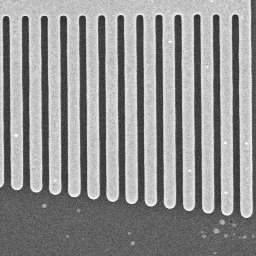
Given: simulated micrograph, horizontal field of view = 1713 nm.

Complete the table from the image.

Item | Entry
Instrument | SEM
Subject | groups of lines, slits or small figures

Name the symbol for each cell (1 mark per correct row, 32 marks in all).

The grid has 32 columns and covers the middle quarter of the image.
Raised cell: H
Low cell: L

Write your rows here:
LHHHLLHHLLLHHLLHHHLLHHHLLHHHLLHH
LHHHLLHHLLLHHLLHHHLLHHHLLHHHLLHH
LHHHLLHHLLLHHLLHHHLLHHHLLHHHLLHH
LHHHLLHHLLLHHLLHHHLLHHHLLHHHLLHH
LHHHLLHHLLLHHLLHHHLLHHHLLHHHLLHH
LHHHLLHHLLLHHLLHHHLLHHHLLHHHLLHH
LHHHLLHHLLLHHLLHHHLLHHHLLHHHLLHH
LHHHLLHHLLLHHLLHHHLLHHHLLHHHLLHH
LHHHLLHHLLLHHLLHHHLLHHHLLHHHLLHH
LHHHLLHHLLLHHLLHHHLLHHHLLHHHLLHH
LHHHLLHHLLLHHLLHHHLLHHHLLHHHLLHH
LHHHLLHHLLLHHLLHHHLLHHHLLHHHLLHH
LHHHLLHHLLLHHLLHHHLLHHHLLHHHLLHH
LHHHLLHHLLLHHLLHHHLLHHHLLHHHLLHH
LHHHLLHHLLLHHLLHHHLLHHHLLHHHLLHH
LHHHLLHHHLLHHLLHHHLLHHHLLHHHLLHH
LHHHLLHHHLLHHLLHHHLLHHHLLHHHLLHH
LHHHLLHHHLLHHLLHHHLLHHHLLHHHLLHH
LHHHLLHHHLLHHLLHHHLLHHHLLHHHLLHH
LHHHLLHHHLLHHLLHHHLLHHHLLHHHLLHH
LHHHLLHHHLLHHLLHHHLLHHHLLHHHLLHH
LHHHLLHHHLLHHLLHHHLLHHHLLHHHLLHH
LHHHLLHHHLLHHLLHHHLLHHHLLHHHLLHH
LHHHLLHHHLLHHLLHHHLLHHHLLHHHLLHH
LHHHLLHHHLLHHLLHHHLLHHHLLHHHLLHH
LHHHLLHHHLLHHHLHHHLLHHHLLHHHLLHH
LHHHLLHHHLLHHHLHHHLLHHHLLHHHLLHH
LHHHLLHHHLLHHHLHHHLLHHHLLHHHLLHH
LHHHLLHHHLLHHHLHHHLLHHHLLHHHLLHH
LHHHLLHHHLLHHHLHHHLLHHHLLHHHLLHH
LHHHLLHHHLLHHHLHHHLLHHHLLHHHLLHH
LHHHLLHHHLLHHHLHHHLLHHHLLHHHLLHH